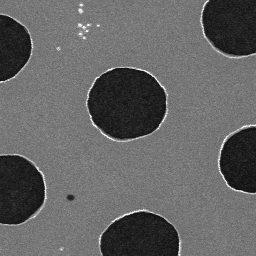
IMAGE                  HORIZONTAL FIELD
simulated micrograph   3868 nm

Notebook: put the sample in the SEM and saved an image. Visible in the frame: holes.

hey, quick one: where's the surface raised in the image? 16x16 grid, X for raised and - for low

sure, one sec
XXXXXXXXXXXXX---
-XXXXXXXXXXXX---
--XXXXXXXXXXX---
--XXXXXXXXXXXXXX
-XXXXXX--XXXXXXX
XXXXXX----XXXXXX
XXXXX-----XXXXXX
XXXXXX----XXXXXX
XXXXXXX--XXXXXX-
XXXXXXXXXXXXXX--
--XXXXXXXXXXXX--
---XXXXXXXXXXX--
---XXXXXXXXXXXXX
--XXXXXX--XXXXXX
XXXXXXX----XXXXX
XXXXXX-----XXXXX